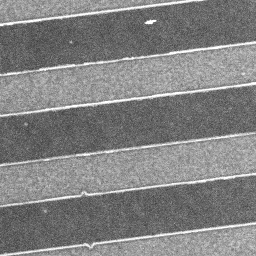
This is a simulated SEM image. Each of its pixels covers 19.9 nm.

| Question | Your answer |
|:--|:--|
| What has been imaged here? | one or a few lines or trenches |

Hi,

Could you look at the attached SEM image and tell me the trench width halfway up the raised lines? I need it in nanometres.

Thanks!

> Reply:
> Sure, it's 800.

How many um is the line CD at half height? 0.977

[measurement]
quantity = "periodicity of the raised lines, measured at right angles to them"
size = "1780 nm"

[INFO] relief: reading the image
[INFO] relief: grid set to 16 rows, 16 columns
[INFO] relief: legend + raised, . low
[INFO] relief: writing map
........++++++++
++++++++++++++++
++++++++++++++++
++++++++++......
++..............
..............++
......++++++++++
++++++++++++++++
+++++++++++++++.
+++++++.........
................
...........+++++
...+++++++++++++
++++++++++++++++
++++++++++++....
++++............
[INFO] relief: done